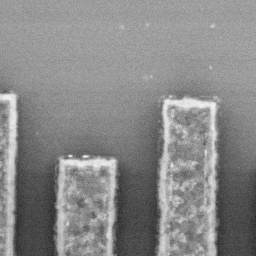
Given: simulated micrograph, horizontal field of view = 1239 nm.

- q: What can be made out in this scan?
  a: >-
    one or a few lines or trenches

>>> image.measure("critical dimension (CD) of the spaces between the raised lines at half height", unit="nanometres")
243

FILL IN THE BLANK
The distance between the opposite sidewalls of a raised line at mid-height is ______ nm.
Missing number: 243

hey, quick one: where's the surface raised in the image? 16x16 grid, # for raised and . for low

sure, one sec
................
................
................
................
................
................
#..........#....
#.........###...
#.........###...
#.........###...
#...###...###...
#...###...###...
#...###...###...
#...###...###...
#...###...###...
#...###...###...